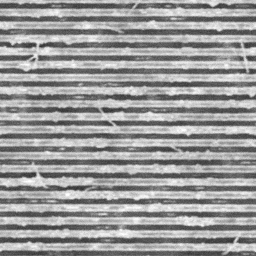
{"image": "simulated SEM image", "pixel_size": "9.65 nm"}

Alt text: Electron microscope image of parallel lines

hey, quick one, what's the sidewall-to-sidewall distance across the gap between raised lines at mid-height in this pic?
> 70 nanometres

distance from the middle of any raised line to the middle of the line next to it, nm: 126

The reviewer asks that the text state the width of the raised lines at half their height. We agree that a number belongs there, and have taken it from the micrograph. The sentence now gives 60.3 nanometers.